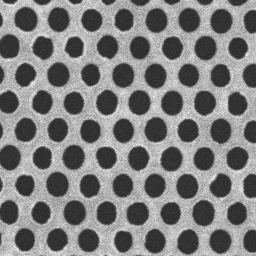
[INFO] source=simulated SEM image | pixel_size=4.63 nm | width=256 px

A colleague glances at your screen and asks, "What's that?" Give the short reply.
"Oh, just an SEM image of a regular array of holes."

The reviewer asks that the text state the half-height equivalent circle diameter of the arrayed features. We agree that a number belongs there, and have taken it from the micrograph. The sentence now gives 22.2 px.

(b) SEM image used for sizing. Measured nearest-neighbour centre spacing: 146 nm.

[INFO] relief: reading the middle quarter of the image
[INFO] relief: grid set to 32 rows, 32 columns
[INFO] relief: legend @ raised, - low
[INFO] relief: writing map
@@@@@---@@@@@----@@@@---@@@@@@--
-@@@-----@@@-----@@@-----@@@@---
-@@@-----@@@------@@------@@----
-@@@-----@@@-----@@@------@@@---
-@@@@----@@@-----@@@@----@@@@---
@@@@@@-@@@@@@---@@@@@----@@@@@@-
@@@@@@@@@@-@@@@@@@-@@@@@@@@@@@@@
@---@@@@@----@@@@----@@@@----@@@
-----@@@-----@@@-----@@@------@@
-----@@@------@@------@@------@@
-----@@@-----@@@------@@------@@
-----@@@-----@@@@----@@@@----@@@
@@--@@@@@---@@@@@@--@@@@@@--@@@@
@@@@@@@@@@@@@@@@@@@@@@--@@@@@@@@
@@@@@---@@@@@----@@@@----@@@@---
-@@@-----@@@@----@@@------@@----
-@@@-----@@@------@@------@@----
-@@@-----@@@-----@@@------@@----
@@@@-----@@@@----@@@@----@@@@---
@@@@@@-@@@@@@@--@@@@@@--@@@@@@--
@--@@@@@@@@@@@@@@@@@@@@@@@@@@@@@
-----@@@@----@@@@----@@@@----@@@
-----@@@-----@@@-----@@@-----@@@
-----@@@-----@@@-----@@@------@@
-----@@@@----@@@-----@@@-----@@@
----@@@@@---@@@@@----@@@-----@@@
@@-@@@@@@@@@@@@@@@-@@@@@@@--@@@@
@@@@@@-@@@@@@@@@@@@@@@@@@@@@@@-@
-@@@@---@@@@@----@@@@----@@@@---
-@@@-----@@@-----@@@-----@@@----
-@@@-----@@@-----@@@-----@@@----
-@@@-----@@@-----@@@-----@@@----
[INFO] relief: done